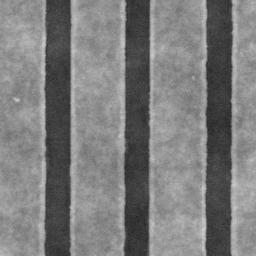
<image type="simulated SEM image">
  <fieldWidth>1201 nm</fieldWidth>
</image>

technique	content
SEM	lines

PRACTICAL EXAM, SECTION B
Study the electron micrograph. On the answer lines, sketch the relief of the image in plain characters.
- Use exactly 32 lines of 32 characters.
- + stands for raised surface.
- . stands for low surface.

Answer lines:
++++++...+++++++...+++++++...+++
++++++...+++++++...+++++++...+++
++++++...+++++++...+++++++...+++
++++++...+++++++...+++++++...+++
++++++...+++++++...+++++++...+++
++++++...+++++++...+++++++...+++
++++++...++++++....+++++++...+++
++++++...++++++....+++++++...+++
++++++...+++++++...+++++++...+++
++++++...+++++++...+++++++...+++
++++++...++++++....+++++++...+++
++++++...++++++....+++++++...+++
++++++...++++++....+++++++...+++
++++++...+++++++...+++++++...+++
++++++...+++++++...+++++++...+++
++++++...+++++++...+++++++...+++
++++++...++++++....+++++++...+++
++++++...++++++....+++++++...+++
++++++...++++++....+++++++...+++
++++++...++++++....+++++++...+++
++++++...++++++....+++++++...+++
++++++...++++++....+++++++...+++
++++++...++++++....+++++++...+++
++++++...+++++++...+++++++...+++
++++++...+++++++...+++++++...+++
++++++...++++++....+++++++...+++
++++++...++++++....+++++++...+++
+++++....++++++....+++++++...+++
+++++....++++++....+++++++...+++
+++++....+++++++...+++++++...+++
+++++....++++++....+++++++...+++
+++++....++++++....+++++++...+++